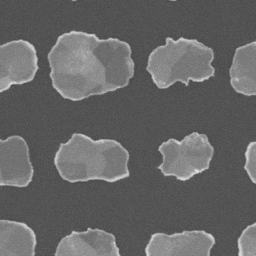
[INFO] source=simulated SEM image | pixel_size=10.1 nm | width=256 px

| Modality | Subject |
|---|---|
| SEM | raised bodies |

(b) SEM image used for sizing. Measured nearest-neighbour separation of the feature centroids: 932 nanometers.